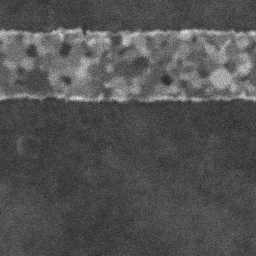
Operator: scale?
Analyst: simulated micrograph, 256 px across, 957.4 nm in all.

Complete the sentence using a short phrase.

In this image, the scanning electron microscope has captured one or a few lines or trenches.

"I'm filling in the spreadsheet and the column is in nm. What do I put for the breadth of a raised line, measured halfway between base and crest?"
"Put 251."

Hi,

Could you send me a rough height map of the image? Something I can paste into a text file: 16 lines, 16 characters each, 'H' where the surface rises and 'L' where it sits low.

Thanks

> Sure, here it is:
LLLLLLLLLLLLLLLL
LLLLLLLLLLLLLLLL
HHHHHHHHHHHHHHHH
HHHHHHHHHHHHHHHH
HHHHHHHHHHHHHHHH
HHHHHHHHHHHHHHHH
LLLLLLLLLLLLLLLL
LLLLLLLLLLLLLLLL
LLLLLLLLLLLLLLLL
LLLLLLLLLLLLLLLL
LLLLLLLLLLLLLLLL
LLLLLLLLLLLLLLLL
LLLLLLLLLLLLLLLL
LLLLLLLLLLLLLLLL
LLLLLLLLLLLLLLLL
LLLLLLLLLLLLLLLL